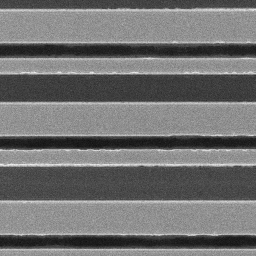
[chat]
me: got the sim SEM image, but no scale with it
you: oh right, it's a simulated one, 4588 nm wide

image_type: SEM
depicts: lines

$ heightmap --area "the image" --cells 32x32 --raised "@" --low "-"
--------------------------------
@@@@@@@@@@@@@@@@@@@@@@@@@@@@@@@@
@@@@@@@@@@@@@@@@@@@@@@@@@@@@@@@@
@@@@@@@@@@@@@@@@@@@@@@@@@@@@@@@@
@@@@@@@@@@@@@@@@@@@@@@@@@@@@@@@@
--------------------------------
--------------------------------
@@@@@@@@@@@@@@@@@@@@@@@@@@@@@@@@
@@@@@@@@@@@@@@@@@@@@@@@@@@@@@@@@
--------------------------------
--------------------------------
--------------------------------
--------------------------------
@@@@@@@@@@@@@@@@@@@@@@@@@@@@@@@@
@@@@@@@@@@@@@@@@@@@@@@@@@@@@@@@@
@@@@@@@@@@@@@@@@@@@@@@@@@@@@@@@@
@@@@@@@@@@@@@@@@@@@@@@@@@@@@@@@@
--------------------------------
--------------------------------
@@@@@@@@@@@@@@@@@@@@@@@@@@@@@@@@
@@@@@@@@@@@@@@@@@@@@@@@@@@@@@@@@
--------------------------------
--------------------------------
--------------------------------
--------------------------------
@@@@@@@@@@@@@@@@@@@@@@@@@@@@@@@@
@@@@@@@@@@@@@@@@@@@@@@@@@@@@@@@@
@@@@@@@@@@@@@@@@@@@@@@@@@@@@@@@@
@@@@@@@@@@@@@@@@@@@@@@@@@@@@@@@@
--------------------------------
--------------------------------
@@@@@@@@@@@@@@@@@@@@@@@@@@@@@@@@